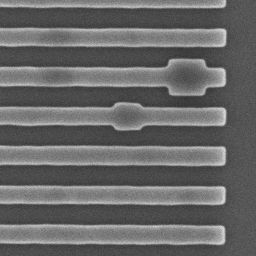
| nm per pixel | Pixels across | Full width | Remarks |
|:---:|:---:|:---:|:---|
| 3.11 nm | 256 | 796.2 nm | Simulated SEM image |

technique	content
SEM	wiring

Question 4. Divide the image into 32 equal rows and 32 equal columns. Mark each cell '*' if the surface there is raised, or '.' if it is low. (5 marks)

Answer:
****************************....
................................
................................
................................
****************************....
****************************....
................................
.....................****.......
**************..**..******......
****************************....
****************************....
.....................*****......
................................
********************............
****************************....
****************************....
................................
................................
****************************....
****************************....
****************************....
................................
................................
****************************....
****************************....
....................**....*.....
................................
................................
****************************....
****************************....
.....................**....*....
................................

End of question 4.